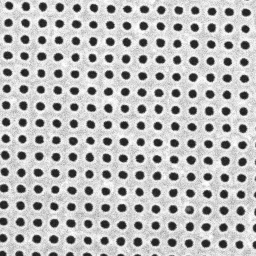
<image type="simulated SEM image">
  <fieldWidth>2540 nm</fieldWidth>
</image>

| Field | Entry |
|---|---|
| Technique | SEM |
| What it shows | a regular array of holes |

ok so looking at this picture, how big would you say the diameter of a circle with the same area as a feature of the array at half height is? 0.0896 um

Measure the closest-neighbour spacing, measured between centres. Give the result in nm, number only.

163